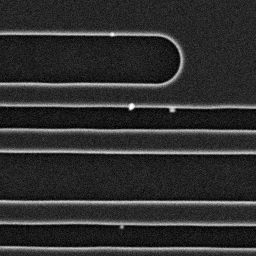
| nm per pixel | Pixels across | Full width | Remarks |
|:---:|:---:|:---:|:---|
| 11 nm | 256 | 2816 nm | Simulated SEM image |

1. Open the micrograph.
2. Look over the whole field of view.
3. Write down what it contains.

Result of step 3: groups of lines, slits or small figures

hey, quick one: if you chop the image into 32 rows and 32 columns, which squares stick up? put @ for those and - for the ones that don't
@@@@@@@@@@@@@@@@@@@@@@@@@@@@@@@@
@@@@@@@@@@@@@@@@@@@@@@@@@@@@@@@@
@@@@@@@@@@@@@@@@@@@@@@@@@@@@@@@@
@@@@@@@@@@@@@@@@@@@@@@@@@@@@@@@@
--------------------@@@@@@@@@@@@
----------------------@@@@@@@@@@
----------------------@@@@@@@@@@
-----------------------@@@@@@@@@
----------------------@@@@@@@@@@
----------------------@@@@@@@@@@
@@@@@@--@@@@@@------@@@@@@@@@@@@
@@@@@@@@@@@@@@@@@@@@@@@@@@@@@@@@
@@@@@@@@@@@@@@@@@@@@@@@@@@@@@@@@
----------------@---------------
--------------------------------
--------------------------------
@@@@@@@@@@@@@@@@@@@@@@@@@@@@@@@@
@@@@@@@@@@@@@@@@@@@@@@@@@@@@@@@@
@@@@@@@@@@@@@@@@@@@@@@@@@@@@@@@@
--------------------------------
--------------------------------
--------------------------------
--------------------------------
--------------------------------
--------------------------------
@@@@@@@@@@@@@@@@@@@@@@@@@@@@@@@@
@@@@@@@@@@@@@@@@@@@@@@@@@@@@@@@@
@@@@@@@@@@@@@@@@@@@@@@@@@@@@@@@@
--------------------------------
--------------------------------
--------------------------------
@@@@@@@@@@@@@@@@@@@@@@@@@@@@@@@@